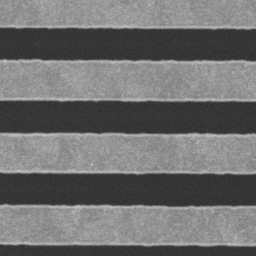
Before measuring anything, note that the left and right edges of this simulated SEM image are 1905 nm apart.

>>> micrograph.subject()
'lines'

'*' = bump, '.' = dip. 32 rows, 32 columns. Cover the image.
********************************
********************************
********************************
......*...*...*.****************
................................
................................
................................
*...*...........................
********************************
********************************
********************************
********************************
********************************
................................
................................
................................
................................
********************************
********************************
********************************
********************************
*.**.***************************
................................
................................
................................
................................
********************************
********************************
********************************
********************************
...*****************************
................................